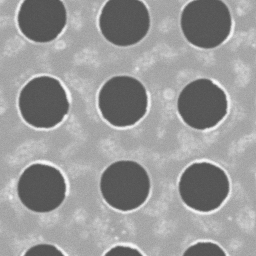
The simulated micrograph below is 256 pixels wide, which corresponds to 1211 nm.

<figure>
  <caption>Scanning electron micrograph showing holes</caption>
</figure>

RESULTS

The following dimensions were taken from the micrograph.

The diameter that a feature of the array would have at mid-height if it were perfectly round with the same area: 236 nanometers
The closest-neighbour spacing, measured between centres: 375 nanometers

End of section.